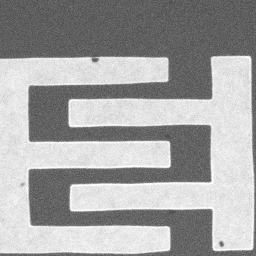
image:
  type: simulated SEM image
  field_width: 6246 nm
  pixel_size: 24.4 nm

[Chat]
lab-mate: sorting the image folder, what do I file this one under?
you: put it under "groups of lines, slits or small figures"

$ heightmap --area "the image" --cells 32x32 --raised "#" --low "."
................................
................................
................................
................................
................................
................................
................................
#####################.....#####.
#####################......####.
#####################......####.
#########..................####.
###........................####.
###.........########......#####.
###......######################.
###......######################.
###......############.....#####.
###.......................#####.
####......................#####.
#####################.....#####.
#####################.....######
#####################.....######
####......................######
###.......................######
###......#######################
###......#######################
####.....#######################
####.......................#####
####.......................#####
#####################......#####
#####################......#####
#####################......#####
#######...#########.............